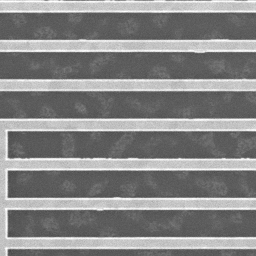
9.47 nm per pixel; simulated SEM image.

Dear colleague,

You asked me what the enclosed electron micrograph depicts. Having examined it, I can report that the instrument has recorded parallel lines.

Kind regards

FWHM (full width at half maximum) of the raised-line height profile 0.0935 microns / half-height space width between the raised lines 0.278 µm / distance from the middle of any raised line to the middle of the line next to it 0.373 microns